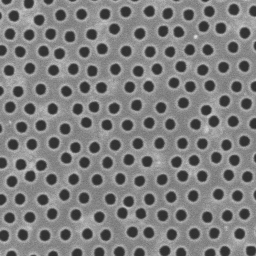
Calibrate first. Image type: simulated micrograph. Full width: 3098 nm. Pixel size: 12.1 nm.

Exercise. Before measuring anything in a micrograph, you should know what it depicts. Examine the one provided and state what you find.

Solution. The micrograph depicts a regular array of holes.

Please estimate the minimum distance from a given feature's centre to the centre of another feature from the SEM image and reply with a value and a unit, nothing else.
220 nm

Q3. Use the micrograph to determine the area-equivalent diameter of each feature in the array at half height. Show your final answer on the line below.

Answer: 135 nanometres